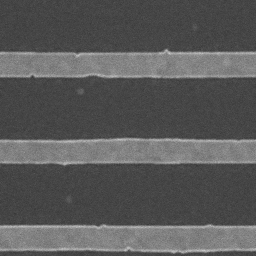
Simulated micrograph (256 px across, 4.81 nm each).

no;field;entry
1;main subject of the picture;one or a few lines or trenches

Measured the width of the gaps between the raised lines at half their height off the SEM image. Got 304 nm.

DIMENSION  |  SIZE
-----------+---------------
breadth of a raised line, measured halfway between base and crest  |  115 nanometres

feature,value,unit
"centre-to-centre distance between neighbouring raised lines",417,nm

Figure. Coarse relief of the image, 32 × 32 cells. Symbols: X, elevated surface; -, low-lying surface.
--------------------------------
--------------------------------
--------------------------------
--------------------------------
--------------------------------
--------------------------------
--------------------X-----------
XXXXXXXXXXXXXXXXXXXXXXXXXXXXXXXX
XXXXXXXXXXXXXXXXXXXXXXXXXXXXXXXX
XXXXXXXXXXX--XXXXXXXXXXXXXXXXXXX
--------------------------------
--------------------------------
--------------------------------
--------------------------------
--------------------------------
--------------------------------
--------------------------------
------------XXXXXXXXXXX---------
XXXXXXXXXXXXXXXXXXXXXXXXXXXXXXXX
XXXXXXXXXXXXXXXXXXXXXXXXXXXXXXXX
--------------------------------
--------------------------------
--------------------------------
--------------------------------
--------------------------------
--------------------------------
--------------------------------
--------------------------------
XXXXXXXXXXXXXXXXXXXXXXXXXXXXXXXX
XXXXXXXXXXXXXXXXXXXXXXXXXXXXXXXX
XXXXXXXXXXXXXXXXXXXXXXXXXXXXXXXX
---------------------XXX--------